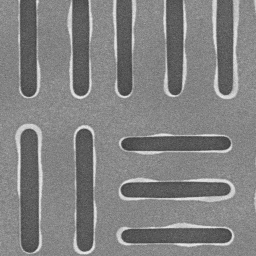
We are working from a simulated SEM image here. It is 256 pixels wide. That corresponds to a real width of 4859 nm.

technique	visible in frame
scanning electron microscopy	groups of lines, slits or small figures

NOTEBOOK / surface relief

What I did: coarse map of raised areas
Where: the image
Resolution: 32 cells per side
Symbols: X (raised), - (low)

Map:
XX---XXXX--XXX---XXXX--XXXX---XX
XX---XXXX--XXX---XXXX--XXXX---XX
XX---XXXX--XXX---XXXX--XXXX---XX
XX---XXXX--XXX---XXXX--XXXX---XX
XX---XXXX--XXX---XXXX--XXXX--XXX
XX---XXXX--XXX---XXXX--XXXX--XXX
XX---XXXX--XXXX--XXXX--XXXX--XXX
XX---XXXX--XXXX--XXXX--XXXX--XXX
XX---XXXX--XXXX--XXXX--XXXX--XXX
XX---XXXX--XXXX--XXXX--XXXX---XX
XX---XXXX--XXXX--XXXX--XXXX---XX
XXX--XXXX--XXXX-XXXXX--XXXX--XXX
XXXXXXXXXXXXXXXXXXXXXXXXXXXXXXXX
XXXXXXXXXXXXXXXXXXXXXXXXXXXXXXXX
XXXXXXXXXXXXXXXXXXXXXXXXXXXXXXXX
XXXXXXXXXXXXXXXXXXXXXXXXXXXXXXXX
XX---XXXXX-XXXXXXXXXXXXXXXXXXXXX
XX---XXXX---XXX--------------XXX
XX---XXXX---XXX--------------XXX
XX---XXXX---XXXXXXXXXXXXXXXXXXXX
XX---XXXX---XXXXXXXXXXXXXXXXXXXX
XX---XXXX---XXXXXXXXXXXXXXXXXXXX
XX---XXXX---XXXXX-XXXXXXX--XXXXX
XX---XXXX---XXX--------------XXX
XX---XXXX---XXX--------------XXX
XX---XXXX---XXXXXXXXXXXXXXXXXXXX
XX---XXXX---XXXXXXXXXXXXXXXXXXXX
XX---XXXX---XXXXXXXXXXXXXXXXXXXX
XX---XXXX---XXXX------------XXXX
XXX--XXXX---XXX--------------XXX
XXX--XXXX---XXXX------------XXXX
XXX-XXXXXX-XXXXXXXXXXXXXXXXXXXXX